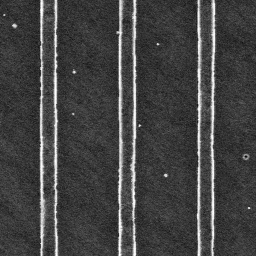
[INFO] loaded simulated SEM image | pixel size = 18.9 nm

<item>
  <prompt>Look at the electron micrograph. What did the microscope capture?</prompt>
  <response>lines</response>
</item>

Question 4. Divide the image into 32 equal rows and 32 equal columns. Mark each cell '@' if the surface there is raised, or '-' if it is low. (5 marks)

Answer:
-----@@--------@@--------@@-----
-----@@--------@@--------@@-----
-----@@--------@@--------@@-----
-----@@--------@@--------@@-----
-----@@--------@@--------@@-----
-----@@--------@@--------@@-----
-----@@--------@@--------@@-----
-----@@--------@@--------@@-----
-----@@--------@@--------@@-----
-----@@--------@@--------@@-----
-----@@--------@@--------@@-----
-----@@--------@@--------@@-----
-----@@--------@@--------@@-----
-----@@--------@@--------@@-----
-----@@--------@@--------@@-----
-----@@--------@@--------@@-----
-----@@--------@@--------@@-----
-----@@--------@@--------@------
-----@@--------@@--------@------
-----@@--------@@--------@@-----
-----@@--------@@--------@@-----
-----@@--------@@--------@@-----
-----@@--------@@--------@@-----
-----@@--------@@--------@@-----
-----@@--------@@--------@@-----
-----@@--------@@--------@@-----
-----@@--------@@--------@@-----
-----@@--------@@--------@@-----
-----@@--------@@--------@@-----
-----@@--------@@--------@@-----
-----@@--------@@--------@@-----
-----@@--------@@--------@@-----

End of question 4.